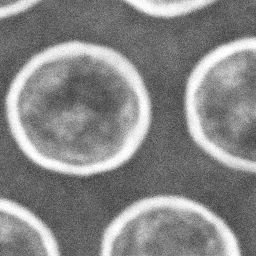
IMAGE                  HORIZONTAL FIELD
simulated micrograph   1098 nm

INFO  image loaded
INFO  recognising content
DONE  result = raised bodies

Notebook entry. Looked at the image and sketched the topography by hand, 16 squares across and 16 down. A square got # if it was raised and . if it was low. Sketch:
#........##.....
................
................
...####.......##
..######.....###
.########...####
.########...####
.########...####
.########....###
..######......##
....##..........
................
................
##......#####...
###....#######..
###....########.